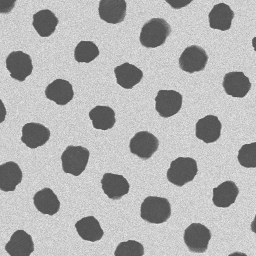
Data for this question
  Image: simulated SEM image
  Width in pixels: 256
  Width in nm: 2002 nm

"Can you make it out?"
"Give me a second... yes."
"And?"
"a regular array of holes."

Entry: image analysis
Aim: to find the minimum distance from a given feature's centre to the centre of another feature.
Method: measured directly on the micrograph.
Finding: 375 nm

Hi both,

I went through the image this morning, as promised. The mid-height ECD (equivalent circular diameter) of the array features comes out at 0.204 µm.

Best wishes